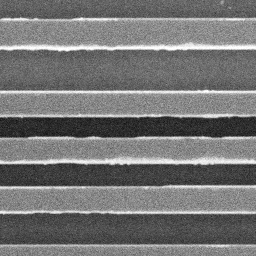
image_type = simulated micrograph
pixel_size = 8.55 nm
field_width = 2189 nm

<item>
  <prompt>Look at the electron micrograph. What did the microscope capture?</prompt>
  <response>lines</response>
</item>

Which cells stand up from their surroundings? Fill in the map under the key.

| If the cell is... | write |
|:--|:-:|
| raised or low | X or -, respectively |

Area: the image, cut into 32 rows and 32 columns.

--------------------------------
--------------------------------
XXXX-----XXXXXXXXXXXXXXXXXXXXXXX
XXXXXXXXXXXXXXXXXXXXXXXXXXXXXXXX
XXXXXXXXXXXXXXXXXXXXXXXXXXXXXXXX
XXXXXXXXXXXXXXXXXXXXXXXXXXXXXXXX
--------------------------------
--------------------------------
--------------------------------
--------------------------------
--------------------------------
XXXXXXXXXXXXXXXXXXXXXXXXXXXXXXXX
XXXXXXXXXXXXXXXXXXXXXXXXXXXXXXXX
XXXXXXXXXXXXXXXXXXXXXXXXXXXXXXXX
XXXXXXXXXXXXXXXXXX-X--XXXX------
--------------------------------
--------------------------------
XXXXXXXXXXXXXXXXXXXXXXXXXXXXXXXX
XXXXXXXXXXXXXXXXXXXXXXXXXXXXXXXX
XXXXXXXXXXXXXXXXXXXXXXXXXXXXXXXX
--------------------------------
--------------------------------
--------------------------------
XXXXXXXXXXXXXXXXXXXXXXXXXXXXXXXX
XXXXXXXXXXXXXXXXXXXXXXXXXXXXXXXX
XXXXXXXXXXXXXXXXXXXXXXXXXXXXXXXX
XXXX--XX------XXXXXXXXXXXXXXXXXX
--------------------------------
--------------------------------
--------------------------------
--------------------------------
XXXXXXXXXXXXXXXXXXXXXXXXXXXXXXXX